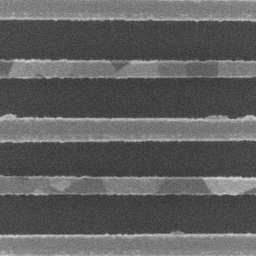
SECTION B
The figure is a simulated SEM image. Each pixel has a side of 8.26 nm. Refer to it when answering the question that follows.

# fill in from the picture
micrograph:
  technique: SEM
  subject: lines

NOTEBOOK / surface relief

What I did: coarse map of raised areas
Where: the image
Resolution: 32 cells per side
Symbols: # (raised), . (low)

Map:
################################
################################
...........................#...#
................................
................................
................................
................................
.......#........................
################################
################################
................................
................................
................................
................................
................................
################################
################################
#############################...
................................
................................
................................
................................
################################
################################
................................
................................
................................
................................
................................
#.#.############################
################################
################################